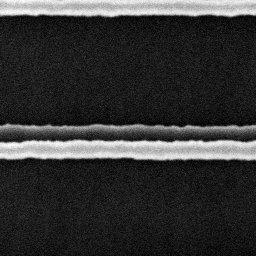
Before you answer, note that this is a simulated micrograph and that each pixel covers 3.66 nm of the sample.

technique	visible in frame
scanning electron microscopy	lines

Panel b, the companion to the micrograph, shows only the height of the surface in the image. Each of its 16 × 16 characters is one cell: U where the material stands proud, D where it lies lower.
UUUUUUUUUUUUUUUU
DDDDDDDDDDDDDDDD
DDDDDDDDDDDDDDDD
DDDDDDDDDDDDDDDD
DDDDDDDDDDDDDDDD
DDDDDDDDDDDDDDDD
DDDDDDDDDDDDDDDD
DDDDDDDDDDDDDDDD
UUUUUUUUUUUUUUUU
UUUUUUUUUUUUUUUU
DDDDDDDDDDDDDDDD
DDDDDDDDDDDDDDDD
DDDDDDDDDDDDDDDD
DDDDDDDDDDDDDDDD
DDDDDDDDDDDDDDDD
DDDDDDDDDDDDDDDD